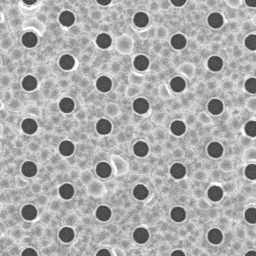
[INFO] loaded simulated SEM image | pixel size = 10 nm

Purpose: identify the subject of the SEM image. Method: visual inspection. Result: a regular array of holes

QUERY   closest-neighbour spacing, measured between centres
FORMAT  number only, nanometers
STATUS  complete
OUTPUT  427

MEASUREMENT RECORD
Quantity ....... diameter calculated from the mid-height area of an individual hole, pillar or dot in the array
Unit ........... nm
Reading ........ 167